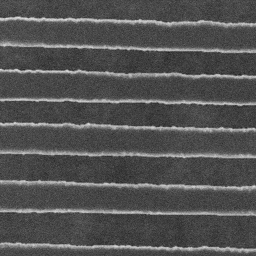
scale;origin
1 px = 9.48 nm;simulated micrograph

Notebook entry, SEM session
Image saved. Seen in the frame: lines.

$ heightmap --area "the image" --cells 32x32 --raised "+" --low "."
................................
................................
++++++++++++.+..................
++++++++++++++++++++++++++++++++
++++++++++++++++++++++++++++++++
++++++++++++++++++++++++++++++++
............................++.+
................................
................................
+++++++++++++++++++++++++++++...
++++++++++++++++++++++++++++++++
++++++++++++++++++++++++++++++++
++++++++++++++++++++++++++++++++
................................
................................
++++............................
++++++++++++++++++++++++++++++++
++++++++++++++++++++++++++++++++
++++++++++++++++++++++++++++++++
......................++..++++++
................................
................................
................................
++++++++++++++++++++++++++++++++
++++++++++++++++++++++++++++++++
++++++++++++++++++++++++++++++++
..........++++++++++++++++++++++
................................
................................
................................
+...............................
++++++++++++++++++++++++++++++++